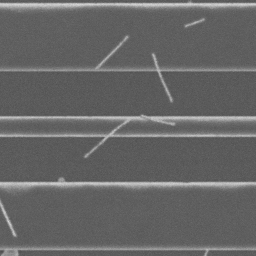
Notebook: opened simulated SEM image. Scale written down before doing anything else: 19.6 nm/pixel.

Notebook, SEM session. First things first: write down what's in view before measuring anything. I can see lines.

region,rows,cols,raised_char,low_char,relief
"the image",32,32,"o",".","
...........ooooo............o..o
oooooooooooooooooooooooooooooooo
oooooooooooooooooooooooooooooooo
oooooooooooooooooooooooooooooooo
oooooooooooooooooooooooooooooooo
oooooooooooooooooooooooooooooooo
oooooooooooooooooooooooooooooooo
oooooooooooooooooooooooooooooooo
oooooooooooooooooooooooooooooooo
................................
................................
................................
................................
................................
................................
oooooooooooooooooooooooooooooooo
oooooooooooooooooooooooooooooooo
................................
................................
................................
................................
................................
................................
oooooooooooooooooooooooooooooooo
oooooooooooooooooooooooooooooooo
oooooooooooooooooooooooooooooooo
oooooooooooooooooooooooooooooooo
oooooooooooooooooooooooooooooooo
oooooooooooooooooooooooooooooooo
oooooooooooooooooooooooooooooooo
oooooooooooooooooooooooooooooooo
................................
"